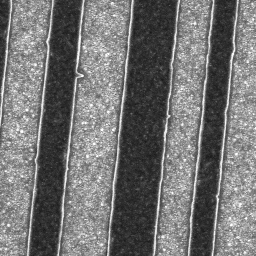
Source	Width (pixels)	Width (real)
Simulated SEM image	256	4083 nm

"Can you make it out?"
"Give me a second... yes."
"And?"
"one or a few lines or trenches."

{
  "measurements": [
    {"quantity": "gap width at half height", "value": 639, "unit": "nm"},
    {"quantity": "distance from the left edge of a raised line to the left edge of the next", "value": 1250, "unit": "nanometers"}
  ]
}